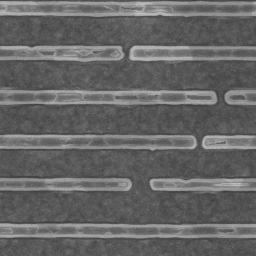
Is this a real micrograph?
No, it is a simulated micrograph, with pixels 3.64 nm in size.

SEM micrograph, parallel lines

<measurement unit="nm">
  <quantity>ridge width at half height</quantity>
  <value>43.6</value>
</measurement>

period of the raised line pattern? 162 nm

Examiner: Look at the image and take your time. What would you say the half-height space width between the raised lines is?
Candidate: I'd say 118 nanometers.